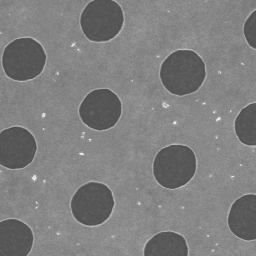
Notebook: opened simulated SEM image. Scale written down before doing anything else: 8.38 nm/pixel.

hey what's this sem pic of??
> holes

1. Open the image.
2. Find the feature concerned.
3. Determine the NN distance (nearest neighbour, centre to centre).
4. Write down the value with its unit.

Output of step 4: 756 nm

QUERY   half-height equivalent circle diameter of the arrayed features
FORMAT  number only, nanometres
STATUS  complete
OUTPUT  364